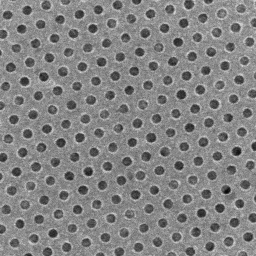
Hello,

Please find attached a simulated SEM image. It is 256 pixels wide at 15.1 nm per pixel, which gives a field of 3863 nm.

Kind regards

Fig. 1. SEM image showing a regular array of holes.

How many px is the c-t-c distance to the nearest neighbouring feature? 19.5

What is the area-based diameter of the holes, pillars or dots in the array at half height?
152 nanometres